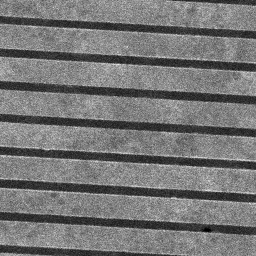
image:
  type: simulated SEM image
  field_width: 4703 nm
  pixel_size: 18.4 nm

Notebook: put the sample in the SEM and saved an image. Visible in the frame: parallel lines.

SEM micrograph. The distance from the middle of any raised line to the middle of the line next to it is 601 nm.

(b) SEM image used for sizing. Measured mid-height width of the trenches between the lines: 174 nm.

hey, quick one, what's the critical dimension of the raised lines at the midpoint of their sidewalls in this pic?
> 429 nm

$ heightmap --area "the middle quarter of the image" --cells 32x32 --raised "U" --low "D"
UUUUUUUUUUUUUUUUUUUDDDDDDDDDDDDU
UUUUUUUUUUUUUUUUUUUUUUUUUUUUUUUU
UUUUUUUUUUUUUUUUUUUUUUUUUUUUUUUU
UUUUUUUUUUUUUUUUUUUUUUUUUUUUUUUU
UUUUUUUUUUUUUUUUUUUUUUUUUUUUUUUU
UUDDDDDDUUUUUUUUUUUUUUUUUUUUUUUU
UUDDDDDDDDDDDDDDDDDDDDDDDUUUUUUU
DDUUDDDDDDDDDDDDDDDDDDDDDDDDDDDD
UUUUUUUUUUUUUUUUUDDDDDDDDDDDDDDD
UUUUUUUUUUUUUUUUUUUUUUUUUUUUUUUU
UUUUUUUUUUUUUUUUUUUUUUUUUUUUUUUU
UUUUUUUUUUUUUUUUUUUUUUUUUUUUUUUU
UUUUUUUUUUUUUUUUUUUUUUUUUUUUUUUU
DDDDUUUUUUUUUUUUUUUUUUUUUUUUUUUU
DDDDDDDDDDDDDDDDDDDDDDDUUUUUUUUU
DDDDDDDDDDDDDDDDDDDDDDDDDDDDDDDD
UUUUUUUUUUUUUDDDDDDDDDDDDDDDDDDD
UUUUUUUUUUUUUUUUUUUUUUUUUUUUUUDD
UUUUUUUUUUUUUUUUUUUUUUUUUUUUUUUU
UUUUUUUUUUUUUUUUUUUUUUUUUUUUUUUU
UUUUUUUUUUUUUUUUUUUUUUUUUUUUUUUU
DDDUUUUUUUUUUUUUUUUUUUUUUUUUUUUU
DDDDDDDDDDDDDDDDDDDDUUUUUUUUUUUU
DDDDDDDDDDDDDDDDDDDDDDDDDDDDDDDD
UUUUUUUUUUDDDDDDDDDDDDDDDDDDDDDD
UUUUUUUUUUUUUUUUUUUUUUUUUUDDUDDD
UUUUUUUUUUUUUUUUUUUUUUUUUUUUUUUU
UUUUUUUUUUUUUUUUUUUUUUUUUUUUUUUU
UUUUUUUUUUUUUUUUUUUUUUUUUUUUUUUU
DUUUUUUUUUUUUUUUUUUUUUUUUUUUUUUU
DDDDDDDDDDDDDDDDDDUUUUUUUUUUUUUU
DDDDDDDDDDDDDDDDDDDDDDDDDDDDDDDD